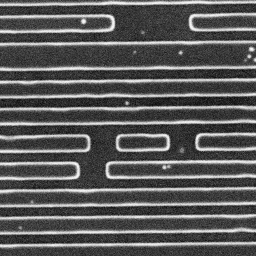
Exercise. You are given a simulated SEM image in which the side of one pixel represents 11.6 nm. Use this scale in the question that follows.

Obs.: groups of lines, slits or small figures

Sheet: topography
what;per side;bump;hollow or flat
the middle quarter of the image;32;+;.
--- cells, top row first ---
++++++++++++++++++++++++++++++++
................................
................................
................................
++++++++++++++++++++++++++++++++
++++++++++++++++++++++++++++++++
++++++++++++++++++++++++++++++++
++++++++++++++++++++++++++++++++
................................
................................
................................
++++++++++++++++++++++++++++++++
++++++++++++++++++++++++++++++++
++++++++++++++++++++++++++++++++
+++++++++++++++++++++++++++++...
................................
................................
................................
++++++.......+++++++++++++......
++++++.......+++++++++++++......
++++++.......+++++++++++++......
++++++........++++++............
................................
................................
...........................+++++
++++.......+++++++++++++++++++++
++++.......+++++++++++++++++++++
++++.......+++++++++++++++++++++
+++.............................
................................
................................
...............+++++++++++++++++